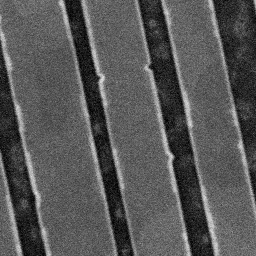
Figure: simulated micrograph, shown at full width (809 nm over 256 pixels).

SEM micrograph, one or a few lines or trenches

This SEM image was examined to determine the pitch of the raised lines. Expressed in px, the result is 77.6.